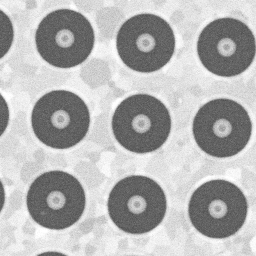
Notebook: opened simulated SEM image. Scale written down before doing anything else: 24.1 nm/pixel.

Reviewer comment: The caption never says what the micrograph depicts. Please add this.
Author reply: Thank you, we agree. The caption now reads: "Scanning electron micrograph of an array of small figures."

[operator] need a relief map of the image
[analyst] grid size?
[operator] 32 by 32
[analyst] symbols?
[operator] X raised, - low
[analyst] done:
XXXXXXXXXXXXXXXXXXXXXXXXXXXXXXXX
-XXXXX----XXXXXXXX-XXXXXXXXXXXXX
--XXX------XXXXX-----XXXXX----XX
--XX--------XXX-------XXX------X
--XX---XX---XX--------XXX-------
--XX--------XX---XX---XX----X---
-XXXX-------XX--------XX----X---
XXXXX------XXXX------XXXX-------
XXXXXXX--XXXXXXX-----XXXX------X
XXXXXXXXXXXXXXXXXXXXXXXXXXX---XX
XXXXXXXXXXXXXXXXXXXXXXXXXXXXXXXX
XXXXXX---XXXXXXXXXXXXXXXXXXXXXXX
-XXXX------XXXX-----XXXXXX----XX
-XXX-------XXX-------XXXX------X
-XXX---X---XXX-------XXX-------X
-XXX---X---XXX---X----XX---X----
-XXX-------XXX-------XXX---X----
XXXXX-----XXXX-------XXX-------X
XXXXXX---XXXXXX-----XXXXX------X
XXXXXXXXXXXXXXXXXXXXXXXXXX----XX
XXXXXXXXXXXXXXXXXXXXXXXXXXXXXXXX
XXXXX----XXXXXXXXXXXXXXXXXXXXXXX
XXXX------XXXXX----XXXXXXX---XXX
-XX--------XXX------XXXX------XX
-XX---XX---XX--------XXX-------X
-XX---XX---XX---XX---XX----X---X
XXX--------XX--------XX----X---X
XXXX------XXXX-------XXX-------X
XXXXX----XXXXXX-----XXXX------XX
XXXXXXXXXXXXXXXXXXXXXXXXX----XXX
XXXXXXXXXXXXXXXXXXXXXXXXXXXXXXXX
XXXXX---XXXXXXXXXXXXXXXXXXXXXXXX